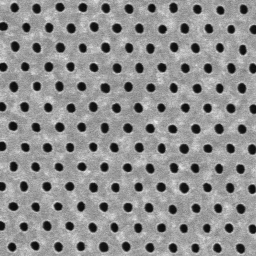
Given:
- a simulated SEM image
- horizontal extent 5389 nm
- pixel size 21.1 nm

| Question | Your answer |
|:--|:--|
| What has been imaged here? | a regular array of holes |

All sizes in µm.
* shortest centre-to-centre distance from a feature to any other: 0.465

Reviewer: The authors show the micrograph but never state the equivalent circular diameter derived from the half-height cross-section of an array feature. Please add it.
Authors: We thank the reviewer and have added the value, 0.199 um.